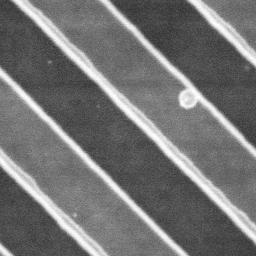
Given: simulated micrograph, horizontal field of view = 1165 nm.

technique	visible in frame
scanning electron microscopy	lines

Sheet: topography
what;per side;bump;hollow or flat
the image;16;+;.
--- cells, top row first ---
..+++++......+++
...+++++.....+++
....+++++......+
.....+++++......
......+++++.....
+......+++++....
++......+++++...
+++......+++++..
++++......+++++.
+++++......+++++
++++++......++++
..+++++......+++
...+++++......++
...++++++......+
.....+++++......
......+++++.....